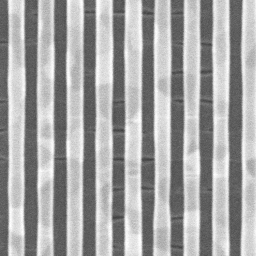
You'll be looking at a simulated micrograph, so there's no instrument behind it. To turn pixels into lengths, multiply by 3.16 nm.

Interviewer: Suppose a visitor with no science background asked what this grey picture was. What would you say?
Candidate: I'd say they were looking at wiring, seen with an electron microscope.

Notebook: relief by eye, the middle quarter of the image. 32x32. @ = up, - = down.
-@@@@---@@@@---@@@@----@@@@---@@
-@@@@---@@@@---@@@@----@@@@---@@
-@@@@---@@@@---@@@@----@@@@---@@
-@@@@---@@@@---@@@@----@@@@---@@
-@@@@---@@@@---@@@@----@@@@---@@
-@@@@---@@@@---@@@@----@@@@---@@
-@@@@---@@@@---@@@@----@@@@---@@
-@@@@---@@@@---@@@@----@@@@---@@
-@@@@---@@@@---@@@@----@@@----@@
-@@@@---@@@@---@@@@----@@@----@@
-@@@@---@@@@---@@@@----@@@----@@
-@@@@---@@@@---@@@@----@@@----@@
-@@@@---@@@@----@@@----@@@----@@
-@@@@---@@@@----@@@----@@@----@@
-@@@@---@@@@----@@@----@@@----@@
-@@@@---@@@@----@@@----@@@----@@
-@@@@---@@@@----@@@----@@@----@@
-@@@@---@@@@---@@@@----@@@----@@
-@@@@---@@@@---@@@@----@@@----@@
-@@@@---@@@@---@@@@----@@@----@@
-@@@@---@@@@---@@@@----@@@----@@
-@@@@---@@@@---@@@@----@@@----@@
-@@@@---@@@@---@@@@----@@@----@@
-@@@@---@@@@---@@@@----@@@----@@
-@@@@---@@@@---@@@@----@@@----@@
-@@@@---@@@@---@@@@----@@@----@@
-@@@@---@@@@---@@@@----@@@----@@
-@@@@---@@@@---@@@@----@@@----@@
-@@@@---@@@@---@@@@----@@@----@@
-@@@@---@@@@---@@@@----@@@----@@
-@@@@---@@@@---@@@@----@@@----@@
-@@@@---@@@@---@@@@----@@@----@@